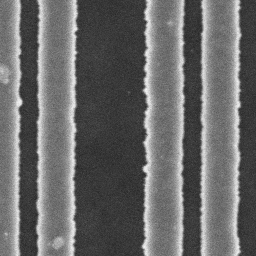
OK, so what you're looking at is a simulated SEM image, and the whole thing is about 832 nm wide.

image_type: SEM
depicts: lines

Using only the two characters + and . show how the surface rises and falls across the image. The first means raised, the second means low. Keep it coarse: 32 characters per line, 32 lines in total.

++...+++++........+++++..+++++..
++...+++++........+++++..+++++..
++...++++.........+++++..+++++..
++...+++++........+++++..+++++..
++...++++.........+++++..+++++..
++...++++.........+++++..+++++..
++...++++.........+++++..+++++..
++...++++.........+++++..+++++..
++...++++.........+++++..+++++..
+++..++++.........+++++..+++++..
++...++++.........+++++..+++++..
++...++++.........+++++..+++++..
+++..++++.........+++++..+++++..
++...++++.........+++++..+++++..
++...++++.........+++++..+++++..
++...++++.........+++++..+++++..
++...++++.........+++++..+++++..
++...++++.........+++++..+++++..
++...++++.........+++++..+++++..
++...++++.........+++++..+++++..
++...++++.........+++++..+++++..
++...++++.........+++++..+++++..
++...++++.........+++++..+++++..
++...++++.........+++++..+++++..
++...++++.........+++++..+++++..
++...++++.........+++++..+++++..
++...++++.........+++++..+++++..
++...++++.........+++++..+++++..
++...++++.........+++++..+++++..
++...++++.........+++++..+++++..
++...++++.........+++++..+++++..
++...++++.........+++++..+++++..